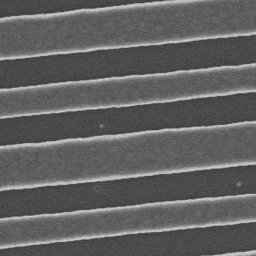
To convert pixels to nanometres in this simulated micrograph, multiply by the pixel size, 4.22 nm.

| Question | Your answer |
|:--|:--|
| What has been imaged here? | lines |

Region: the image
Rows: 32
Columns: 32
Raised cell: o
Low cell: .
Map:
.................ooooooooooooooo
........oooooooooooooooooooooooo
oooooooooooooooooooooooooooooooo
oooooooooooooooooooooooooooooooo
oooooooooooooooooooooooooooooo..
oooooooooooooooooooo............
ooooooooo.......................
................................
...........................ooooo
................oooooooooooooooo
......oooooooooooooooooooooooooo
ooooooooooooooooooooooooooooooo.
oooooooooooooooooooooo..........
oooooooooooooo..................
ooo.............................
.............................ooo
.................ooooooooooooooo
........oooooooooooooooooooooooo
oooooooooooooooooooooooooooooooo
oooooooooooooooooooooooooooooooo
oooooooooooooooooooooooooooooooo
oooooooooooooooooooooo..........
ooooooooooooo...................
oo..............................
.............................ooo
..................oooooooooooooo
.........ooooooooooooooooooooooo
oooooooooooooooooooooooooooooooo
ooooooooooooooooooooooo.........
oooooooooooooo..................
ooooo...........................
...............................o